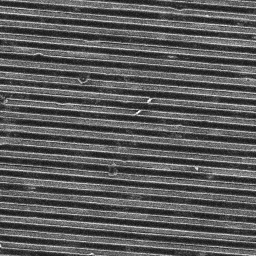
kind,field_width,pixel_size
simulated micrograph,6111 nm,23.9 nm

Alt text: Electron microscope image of parallel lines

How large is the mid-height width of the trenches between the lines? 116 nanometers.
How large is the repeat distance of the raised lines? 310 nm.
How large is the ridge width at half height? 184 nm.